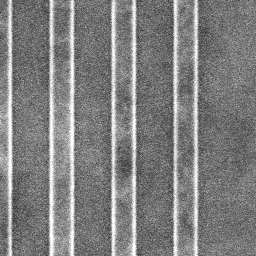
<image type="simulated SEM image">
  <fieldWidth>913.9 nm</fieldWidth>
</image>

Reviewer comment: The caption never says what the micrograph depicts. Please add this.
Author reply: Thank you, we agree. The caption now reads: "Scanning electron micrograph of parallel lines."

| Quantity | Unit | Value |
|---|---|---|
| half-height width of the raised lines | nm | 79.5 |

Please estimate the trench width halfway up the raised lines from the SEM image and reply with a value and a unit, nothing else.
141 nanometers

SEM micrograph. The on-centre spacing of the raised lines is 221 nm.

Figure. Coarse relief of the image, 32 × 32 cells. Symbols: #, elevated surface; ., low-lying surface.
#.....###.....###.....##........
#.....###.....###.....###.......
#.....###.....###.....###.......
#.....###.....###.....###.......
#.....###.....###.....##........
#.....###.....###.....###.......
#.....###.....###.....###.......
#.....###.....###.....##........
#.....###.....###.....###.......
#.....###.....###.....##........
#.....###.....###.....##........
#.....###.....###.....##........
#.....###.....###.....##........
#.....###.....###.....##........
#.....###.....###.....##........
#.....###.....###.....##........
#.....###.....###.....##........
#.....###.....###.....##........
#.....###.....###.....###.......
#.....###.....###.....###.......
#.....###.....###.....###.......
#.....###.....###.....###.......
#.....###.....###.....###.......
#.....###.....###.....##........
#.....###.....###.....###.......
#.....###.....###.....##........
#.....###.....###.....##........
#.....###.....###.....##........
#.....###.....###.....##........
#.....###.....###.....##........
#.....###.....###.....##........
#.....###.....###.....##........